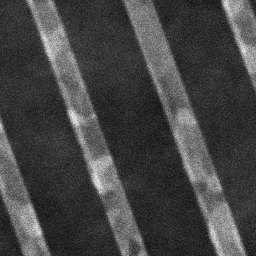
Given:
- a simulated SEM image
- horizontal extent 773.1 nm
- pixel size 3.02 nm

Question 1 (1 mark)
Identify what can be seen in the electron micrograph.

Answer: one or a few lines or trenches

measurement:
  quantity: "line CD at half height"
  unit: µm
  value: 0.0728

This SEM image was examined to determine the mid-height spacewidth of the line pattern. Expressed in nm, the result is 206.